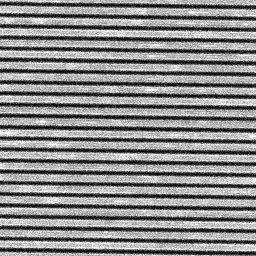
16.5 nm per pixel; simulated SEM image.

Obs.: parallel lines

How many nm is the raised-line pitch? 185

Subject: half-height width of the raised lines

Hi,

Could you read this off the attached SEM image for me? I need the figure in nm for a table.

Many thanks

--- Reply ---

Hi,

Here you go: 108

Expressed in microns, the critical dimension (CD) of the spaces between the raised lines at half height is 0.0765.